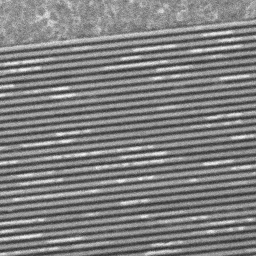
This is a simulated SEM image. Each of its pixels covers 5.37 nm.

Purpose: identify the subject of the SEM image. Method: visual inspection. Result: parallel lines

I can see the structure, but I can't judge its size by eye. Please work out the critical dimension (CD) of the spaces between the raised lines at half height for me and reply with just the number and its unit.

0.02 um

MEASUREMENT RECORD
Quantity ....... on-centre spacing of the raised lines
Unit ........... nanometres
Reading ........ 40.6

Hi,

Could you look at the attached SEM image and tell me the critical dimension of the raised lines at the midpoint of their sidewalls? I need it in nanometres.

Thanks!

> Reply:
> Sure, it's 20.